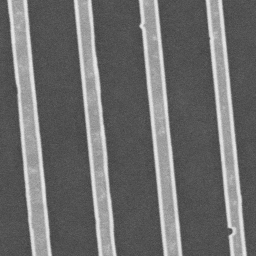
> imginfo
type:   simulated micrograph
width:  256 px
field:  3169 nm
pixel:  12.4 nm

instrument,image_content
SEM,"one or a few lines or trenches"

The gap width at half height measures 631 nm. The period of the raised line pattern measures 65.3 px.